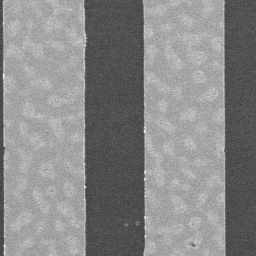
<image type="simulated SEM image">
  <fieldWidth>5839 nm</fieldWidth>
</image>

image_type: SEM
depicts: one or a few lines or trenches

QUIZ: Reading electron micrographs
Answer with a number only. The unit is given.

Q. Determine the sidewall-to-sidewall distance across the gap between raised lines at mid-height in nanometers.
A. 1370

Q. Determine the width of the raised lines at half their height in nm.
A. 1810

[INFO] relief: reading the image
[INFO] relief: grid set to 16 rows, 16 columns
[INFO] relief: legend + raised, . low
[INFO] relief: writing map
+++++....+++++..
+++++....+++++..
+++++....+++++..
+++++....+++++..
+++++....+++++..
+++++....+++++..
+++++....+++++..
+++++....+++++..
+++++....+++++..
+++++....+++++..
+++++....+++++..
+++++....+++++..
+++++....+++++..
+++++....+++++..
+++++....+++++..
+++++....+++++..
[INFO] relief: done